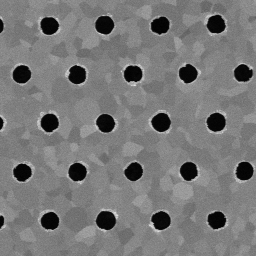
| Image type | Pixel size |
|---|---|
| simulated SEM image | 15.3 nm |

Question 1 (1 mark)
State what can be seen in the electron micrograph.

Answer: a regular array of holes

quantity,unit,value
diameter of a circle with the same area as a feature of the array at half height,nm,281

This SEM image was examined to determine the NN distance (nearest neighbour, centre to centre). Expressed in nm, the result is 844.